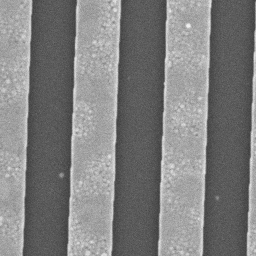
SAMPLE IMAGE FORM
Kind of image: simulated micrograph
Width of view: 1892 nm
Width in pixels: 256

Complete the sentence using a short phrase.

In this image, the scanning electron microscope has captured lines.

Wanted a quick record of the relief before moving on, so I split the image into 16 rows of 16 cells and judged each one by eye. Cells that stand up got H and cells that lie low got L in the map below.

HHLLLHHHLLHHHLLL
HHLLLHHLLLHHHLLL
HHLLLHHLLLHHHLLL
HHLLLHHLLLHHHLLL
HHLLLHHLLLHHHLLL
HHLLLHHLLLHHHLLL
HHLLLHHLLLHHHLLL
HHLLLHHLLLHHHLLL
HHLLLHHLLLHHHLLL
HHLLLHHLLLHHHLLL
HHLLHHHLLLHHHLLL
HHLLHHHLLLHHHLLL
HLLLHHHLLLHHHLLL
HLLLHHHLLLHHHLLL
HLLLHHHLLLHHHLLH
HLLLHHHLLLHHHLLH